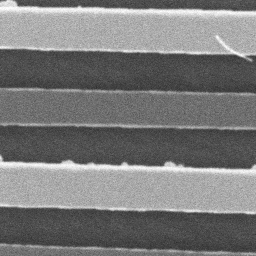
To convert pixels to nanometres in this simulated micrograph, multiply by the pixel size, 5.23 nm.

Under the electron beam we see lines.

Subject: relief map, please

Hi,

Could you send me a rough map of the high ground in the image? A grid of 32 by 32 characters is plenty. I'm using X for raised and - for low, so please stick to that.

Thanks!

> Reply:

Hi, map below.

--------------------------------
XXXXXXXXXXXXXXXXXXXXXXXXXXXXXXXX
XXXXXXXXXXXXXXXXXXXXXXXXXXXXXXXX
XXXXXXXXXXXXXXXXXXXXXXXXXXXXXXXX
XXXXXXXXXXXXXXXXXXXXXXXXXXXXXXXX
XXXXXXXXXXXXXXXXXXXXXXXXXXXXXXXX
--------------------XXXXXXXXXXXX
--------------------------------
--------------------------------
--------------------------------
--------------------------------
XXXXXXXXXXXXXXXXXXXXX-----------
XXXXXXXXXXXXXXXXXXXXXXXXXXXXXXXX
XXXXXXXXXXXXXXXXXXXXXXXXXXXXXXXX
XXXXXXXXXXXXXXXXXXXXXXXXXXXXXXXX
XXXXXXXXXXXXXXXXXXXXXXXXXXXXXXXX
--------------------------------
--------------------------------
--------------------------------
--------------------------------
XXXXX---------------------------
XXXXXXXXXXXXXXXXXXXXXXXXXXXXXXXX
XXXXXXXXXXXXXXXXXXXXXXXXXXXXXXXX
XXXXXXXXXXXXXXXXXXXXXXXXXXXXXXXX
XXXXXXXXXXXXXXXXXXXXXXXXXXXXXXXX
XXXXXXXXXXXXXXXXXXXXXXXXXXXXXXXX
--------------------------XXXXXX
--------------------------------
--------------------------------
--------------------------------
--------------------------------
XXXXXXXXXXXXXXXXXXXXXXXX--------